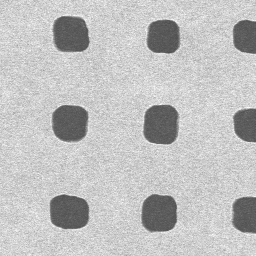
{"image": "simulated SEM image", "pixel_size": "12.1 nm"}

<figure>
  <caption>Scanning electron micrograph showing holes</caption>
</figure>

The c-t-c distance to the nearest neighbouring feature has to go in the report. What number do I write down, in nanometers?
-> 1070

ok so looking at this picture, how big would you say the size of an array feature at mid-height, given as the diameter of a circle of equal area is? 461 nanometres